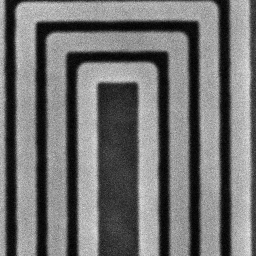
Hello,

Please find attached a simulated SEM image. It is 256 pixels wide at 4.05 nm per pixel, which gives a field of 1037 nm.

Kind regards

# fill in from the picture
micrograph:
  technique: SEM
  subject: groups of lines, slits or small figures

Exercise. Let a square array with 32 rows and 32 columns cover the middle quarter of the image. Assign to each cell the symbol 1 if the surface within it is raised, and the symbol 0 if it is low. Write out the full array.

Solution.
00001111111111111111111000111110
00001111111111111111111000111110
00011111111111111111111000111110
00011111111111111111111000111110
10011111100000000011111000111110
10011111000000000001111000011110
10011111000000000001111000111110
00011111000000000001111000111110
00011111000000000001111000111110
00011111000000000001111000111110
00011111000000000001111000111110
00011111000000000001111000111110
10011111000000000001111000111110
10001111000000000001111000111110
10001111000000000001111000111110
10001111000000000001111000111110
10001111000000000001111000011110
10001111000000000001111000011110
10001111000000000001111000011110
10001111000000000001111000011110
10001111000000000001111000011110
00001111000000000001111000011110
10001111000000000001111000011110
10001111000000000001111000011110
10001111000000000001111000011110
10001111000000000001111000011110
10001111000000000001111000011110
10001111000000000001111000011110
10001111000000000001111000011110
10001111000000000001111000011110
10001111000000000001111000011110
10001111000000000001111000011110